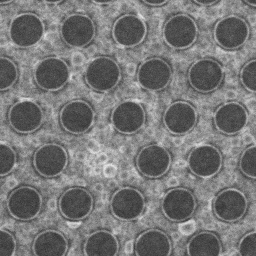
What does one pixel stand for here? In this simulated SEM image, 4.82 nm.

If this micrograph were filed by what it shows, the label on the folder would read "a regular array of raised bodies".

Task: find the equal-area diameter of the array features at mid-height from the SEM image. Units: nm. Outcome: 160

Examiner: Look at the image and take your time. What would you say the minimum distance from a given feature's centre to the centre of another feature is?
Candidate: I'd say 241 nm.